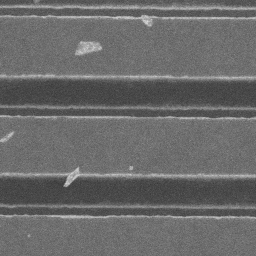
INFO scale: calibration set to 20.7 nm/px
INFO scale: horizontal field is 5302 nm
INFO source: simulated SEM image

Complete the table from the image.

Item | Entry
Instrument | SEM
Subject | lines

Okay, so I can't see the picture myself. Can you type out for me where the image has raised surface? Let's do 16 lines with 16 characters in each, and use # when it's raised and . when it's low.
................
################
################
################
################
................
................
################
################
################
################
................
................
###########.....
################
################